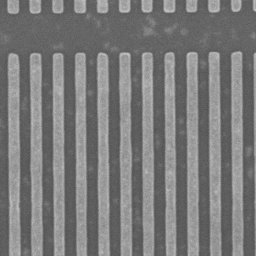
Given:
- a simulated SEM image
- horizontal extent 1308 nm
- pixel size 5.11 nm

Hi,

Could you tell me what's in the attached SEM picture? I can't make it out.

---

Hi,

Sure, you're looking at wiring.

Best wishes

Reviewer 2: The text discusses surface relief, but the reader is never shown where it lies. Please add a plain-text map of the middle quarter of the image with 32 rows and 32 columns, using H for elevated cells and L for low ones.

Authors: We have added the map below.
LLLHHLLLLHHLLLHHLLLLHHLLLHHLLLLH
LLLHHLLLLHHLLLHHLLLLHHLLLHHLLLLH
LLLHHLLLLHHLLLHHHLLLHHLLLHHLLLLH
LLLHHLLLLHHLLLHHHLLLHHLLLHHLLLLH
LLLHHLLLLHHLLLHHHLLLHHLLLHHLLLLH
LLLHHLLLLHHLLLHHHLLLHHLLLHHLLLLH
LLLHHLLLLHHLLLHHHLLLHHLLLLHLLLLH
LLLHHLLLLHHLLLHHHLLLHHLLLLHLLLLH
LLLHHLLLLHHLLLHHHLLLHHLLLLHLLLLH
LLLHHLLLLHHLLLHHHLLLHHLLLHHLLLLH
LLLHHLLLLHHLLLHHHLLLHHLLLHHLLLLH
LLLHHLLLLHHLLLHHHLLLHHLLLLHLLLLH
LLLHHLLLLHHLLLHHHLLLHHLLLLHLLLLH
LLLHHLLLLHHLLLHHHLLLHHLLLLHLLLLH
LLLHHLLLLHHLLLHHHLLLHHLLLLHLLLLH
LLLHHLLLLHHLLLHHHLLLHHLLLHHLLLLH
LLLHHLLLLHHLLLHHHLLLHHLLLHHLLLLH
LLLHHLLLLHHLLLHHHLLLHHLLLHHLLLLH
LLLHHLLLLHHLLLHHHLLLHHLLLHHLLLLH
LLLHHLLLLHHLLLHHHLLLHHLLLLHLLLLH
LLLHHLLLLHHLLLHHHLLLHHLLLLHHLLLH
LLLHHLLLLHHLLLHHHLLLHHLLLHHHLLLH
LLLHHLLLLHHLLLHHHLLLHHLLLHHHLLLH
LLLHHLLLLHHLLLHHHLLLHHLLLHHHLLLH
LLLHHLLLLHHLLLHHHLLLHHLLLHHHLLLH
LLLHHLLLLHHLLLHHHLLLHHLLLHHHLLLH
LLLHHLLLLHHLLLHHHLLLHHLLLLHHLLLH
LLLHHLLLLHHLLLHHHLLLHHLLLLHHLLLH
LLLHHHLLLHHLLLHHHLLLHHLLLLHHLLLH
LLLHHHLLLHHLLLHHHLLLHHLLLLHHLLLH
LLLHHHLLLHHLLLHHHLLLHHLLLLHHLLLH
LLLHHHLLLHHLLLHHHLLLHHLLLLHHLLLH